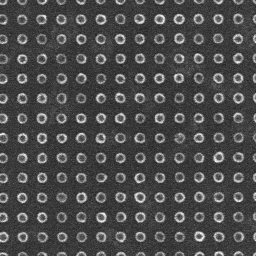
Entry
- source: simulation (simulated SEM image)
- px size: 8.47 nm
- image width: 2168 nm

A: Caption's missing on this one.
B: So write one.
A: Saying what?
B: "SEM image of a regular array of raised bodies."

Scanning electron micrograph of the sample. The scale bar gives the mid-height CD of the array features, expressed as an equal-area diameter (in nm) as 81.1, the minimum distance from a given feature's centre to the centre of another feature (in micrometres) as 0.164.